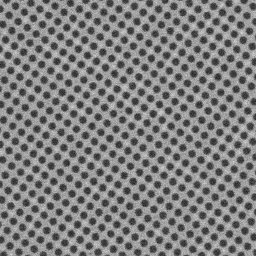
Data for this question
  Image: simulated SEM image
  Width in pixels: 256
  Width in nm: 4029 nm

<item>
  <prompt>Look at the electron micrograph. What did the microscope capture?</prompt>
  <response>a regular array of holes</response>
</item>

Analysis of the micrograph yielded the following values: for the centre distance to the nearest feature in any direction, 10.8 pixels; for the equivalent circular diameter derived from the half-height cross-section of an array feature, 8.29 px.